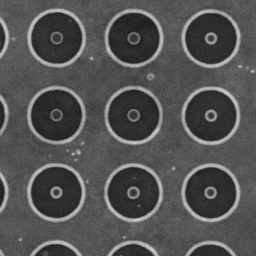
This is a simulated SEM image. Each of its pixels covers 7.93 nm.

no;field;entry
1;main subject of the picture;an array of small figures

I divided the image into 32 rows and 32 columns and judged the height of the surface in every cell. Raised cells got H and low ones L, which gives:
HHHHHHHHHHHHHHHHHHHHHHHHHHHHHHHH
HHHHHHLLHHHHHHHHLLHHHHHHHHLHHHHH
HHHHHLLLLLHHHHLLLLLHHHHHLLLLLHHH
LHHHLLLLLLHHHHLLLLLLHHHLLLLLLLHH
LHHHLLLHLLLHHLLLHLLLHHHLLLHLLLHH
LHHHLLLLLLHHHLLLLLLLHHHLLLLLLLHH
HHHHLLLLLLHHHHLLLLLLHHHLLLLLLHHH
HHHHHLLLLHHHHHHLLLLHHHHHLLLLLHHH
HHHHHHHHHHHHHHHHHHHHHHHHHHHHHHHH
HHHHHHHHHHHHHHHHHHHHHHHHHHHHHHHH
HHHHHHHHHHHHHHHHHHHHHHHHHHHHHHHH
HHHHHLLLLHHHHHHLLLHHHHHHHLLLHHHH
HHHHLLLLLLHHHHLLLLLHHHHHLLLLLHHH
LHHHLLLLLLHHHLLLLLLLHHHLLLLLLLHH
LHHHLLHHLLLHHLLLHLLLHHHLLLHLLLHH
LHHHLLLLLLHHHLLLLLLLHHHLLLLLLLHH
HHHHLLLLLLHHHHLLLLLHHHHHLLLLLHHH
HHHHHHLLLHHHHHHLLLHHHHHHHLLLHHHH
HHHHHHHHHHHHHHHHHHHHHHHHHHHHHHHH
HHHHHHHHHHHHHHHHHHHHHHHHHHHHHHHH
HHHHHHHHHHHHHHHHHHHHHHHHHHHHHHHH
HHHHHLLLLHHHHHLLLLLHHHHHLLLLLHHH
HHHHLLLLLLHHHHLLLLLLHHHLLLLLLHHH
LHHHLLLLLLHHHLLLLLLLHHHLLLLLLLHH
LHHHLLLLLLHHHLLLHLLLHHHLLLHLLLHH
HHHHLLLLLLHHHHLLLLLLHHHLLLLLLHHH
HHHHHLLLLHHHHHLLLLLHHHHHLLLLLHHH
HHHHHHHHHHHHHHHHHHHHHHHHHHLHHHHH
HHHHHHHHHHHHHHHHHHHHHHHHHHHHHHHH
HHHHHHHHHHHHHHHHHHHHHHHHHHHHHHHH
HHHHHHLLHHHHHHHHLLHHHHHHHLLHHHHH
HHHHLLLLLLHHHHLLLLLHHHHHLLLLLHHH